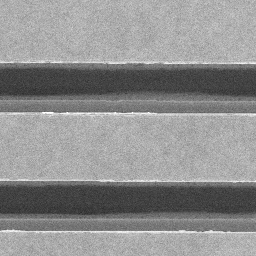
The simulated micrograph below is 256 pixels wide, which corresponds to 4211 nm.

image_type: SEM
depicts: lines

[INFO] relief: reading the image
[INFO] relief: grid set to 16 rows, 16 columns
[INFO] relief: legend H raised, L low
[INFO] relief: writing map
HHHHHHHHHHHHHHHH
HHHHHHHHHHHHHHHH
HHHHHHHHHHHHHHHH
HHHHHHHHHHHHHHHH
LLLLLLLLLLLLLLLL
LLLLLLLLLLLLLLLL
HHHHHHHHHHHHHHHH
HHHHHHHHHHHHHHHH
HHHHHHHHHHHHHHHH
HHHHHHHHHHHHHHHH
HHHHHHHHHHHHHHHH
LLLLLLLLLLLLLLLL
LLLLLLLLLLLLLLLL
LLLLLLLLLLLLLLLL
HHHHHHHHHHHHHHHH
HHHHHHHHHHHHHHHH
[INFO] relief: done